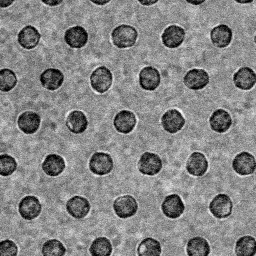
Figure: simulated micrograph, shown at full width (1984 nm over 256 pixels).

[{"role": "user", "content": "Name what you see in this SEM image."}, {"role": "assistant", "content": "a regular array of holes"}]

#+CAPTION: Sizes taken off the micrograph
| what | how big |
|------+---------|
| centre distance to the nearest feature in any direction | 368 nm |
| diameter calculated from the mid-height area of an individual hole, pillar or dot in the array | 186 nm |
